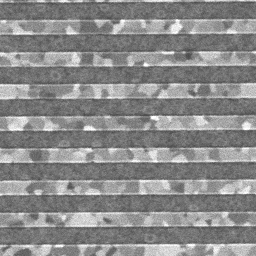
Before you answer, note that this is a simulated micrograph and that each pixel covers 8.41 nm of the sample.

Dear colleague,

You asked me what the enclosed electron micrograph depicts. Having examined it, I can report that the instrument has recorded parallel lines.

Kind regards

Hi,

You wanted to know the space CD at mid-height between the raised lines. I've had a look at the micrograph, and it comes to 164 nanometres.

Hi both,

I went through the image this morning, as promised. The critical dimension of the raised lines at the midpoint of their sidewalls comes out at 107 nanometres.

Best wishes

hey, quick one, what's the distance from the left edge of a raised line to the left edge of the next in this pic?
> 270 nm